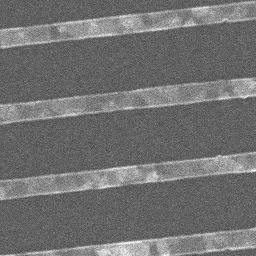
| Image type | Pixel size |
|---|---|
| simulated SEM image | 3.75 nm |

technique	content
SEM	one or a few lines or trenches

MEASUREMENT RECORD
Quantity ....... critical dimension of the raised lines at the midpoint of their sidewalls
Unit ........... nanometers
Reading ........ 62.5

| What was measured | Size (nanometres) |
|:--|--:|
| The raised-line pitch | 283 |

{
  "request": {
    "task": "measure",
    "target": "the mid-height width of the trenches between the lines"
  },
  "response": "220 nm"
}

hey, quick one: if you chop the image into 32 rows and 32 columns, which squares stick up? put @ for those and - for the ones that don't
-----------------------------@@@
---------------------@@@@@@@@@@@
------------@@@@@@@@@@@@@@@@@@--
---@@@@@@@@@@@@@@@@@@-----------
@@@@@@@@@@@@--------------------
@@@-----------------------------
--------------------------------
--------------------------------
--------------------------------
--------------------------------
------------------------@@@@@@@@
---------------@@@@@@@@@@@@@@@@@
-------@@@@@@@@@@@@@@@@@@@@-----
@@@@@@@@@@@@@@@@@---------------
@@@@@@@@------------------------
--------------------------------
--------------------------------
--------------------------------
--------------------------------
-----------------------------@@@
--------------------@@@@@@@@@@@@
-----------@@@@@@@@@@@@@@@@@@@--
--@@@@@@@@@@@@@@@@@@@-----------
@@@@@@@@@@@@@-------------------
@@@-----------------------------
--------------------------------
--------------------------------
--------------------------------
--------------------------------
------------------------@@@@@@@@
--------------@@@@@@@@@@@@@@@@@@
-----@@@@@@@@@@@@@@@@@@@@-------